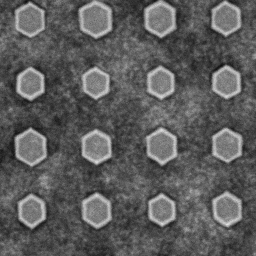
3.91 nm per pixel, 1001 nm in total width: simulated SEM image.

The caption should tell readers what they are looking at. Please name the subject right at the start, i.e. a regular array of raised bodies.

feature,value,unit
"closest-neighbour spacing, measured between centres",249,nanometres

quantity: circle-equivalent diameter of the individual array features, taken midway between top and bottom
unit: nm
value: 116